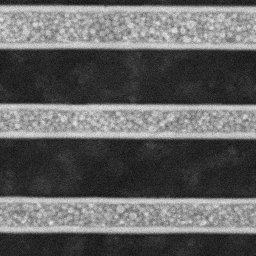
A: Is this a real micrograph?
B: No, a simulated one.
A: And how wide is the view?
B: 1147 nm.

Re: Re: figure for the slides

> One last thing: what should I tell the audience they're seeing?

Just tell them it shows one or a few lines or trenches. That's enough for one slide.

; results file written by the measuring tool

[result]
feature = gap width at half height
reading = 279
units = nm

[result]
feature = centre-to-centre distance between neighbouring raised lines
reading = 0.421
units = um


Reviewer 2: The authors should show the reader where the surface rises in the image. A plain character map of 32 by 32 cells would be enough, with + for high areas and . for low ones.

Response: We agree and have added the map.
................................
++++++++++++++++++++++++++++++++
++++++++++++++++++++++++++++++++
++++++++++++++++++++++++++++++++
++++++++++++++++++++++++++++++++
++++++++++++++++++++++++++++++++
................................
................................
................................
................................
................................
................................
................................
++++++++++++++++++++++++++++++.+
++++++++++++++++++++++++++++++++
++++++++++++++++++++++++++++++++
++++++++++++++++++++++++++++++++
................................
................................
................................
................................
................................
................................
................................
................................
++++++++++++++++++++++++++++++++
++++++++++++++++++++++++++++++++
++++++++++++++++++++++++++++++++
++++++++++++++++++++++++++++++++
................................
................................
................................